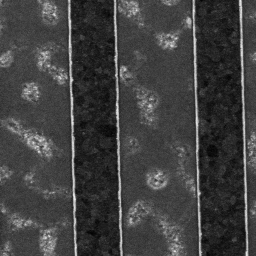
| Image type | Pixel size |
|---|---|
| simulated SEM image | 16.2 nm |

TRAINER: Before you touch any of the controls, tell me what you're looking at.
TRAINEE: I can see one or a few lines or trenches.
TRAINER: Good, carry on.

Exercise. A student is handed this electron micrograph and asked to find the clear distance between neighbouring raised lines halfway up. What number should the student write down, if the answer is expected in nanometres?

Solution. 1280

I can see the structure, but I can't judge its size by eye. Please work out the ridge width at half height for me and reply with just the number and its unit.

0.754 µm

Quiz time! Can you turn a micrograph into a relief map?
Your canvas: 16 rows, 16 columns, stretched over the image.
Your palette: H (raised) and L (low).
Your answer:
LLLLHHHLLLLLHHHL
LLLLHHHLLLLLHHHL
LLLLHHHLLLLLHHHL
LLLLHHHLLLLLHHHL
LLLLHHHLLLLLHHHL
LLLLHHHLLLLLHHHL
LLLLHHHLLLLLHHHL
LLLLLHHLLLLLHHHL
LLLLLHHLLLLLHHHL
LLLLLHHLLLLLHHHL
LLLLLHHLLLLLHHHL
LLLLLHHLLLLLHHHL
LLLLLHHLLLLLHHHL
LLLLLHHHLLLLHHHL
LLLLLHHHLLLLHHHL
LLLLLHHHLLLLHHHL